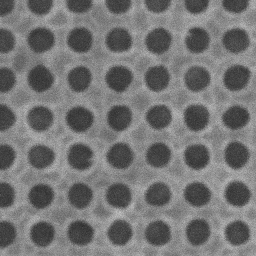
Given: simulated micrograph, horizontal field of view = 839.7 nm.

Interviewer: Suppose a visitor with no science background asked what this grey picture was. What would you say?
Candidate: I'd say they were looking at a regular array of holes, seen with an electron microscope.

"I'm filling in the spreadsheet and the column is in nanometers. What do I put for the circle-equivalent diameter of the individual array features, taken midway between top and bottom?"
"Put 92.6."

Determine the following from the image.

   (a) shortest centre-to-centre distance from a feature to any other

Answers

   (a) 124 nanometers